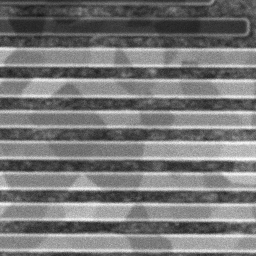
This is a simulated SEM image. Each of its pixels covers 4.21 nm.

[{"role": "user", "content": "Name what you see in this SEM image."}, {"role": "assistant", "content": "parallel lines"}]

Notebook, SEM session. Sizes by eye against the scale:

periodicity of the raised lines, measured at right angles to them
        130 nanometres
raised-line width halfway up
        68.9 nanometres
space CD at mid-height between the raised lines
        0.061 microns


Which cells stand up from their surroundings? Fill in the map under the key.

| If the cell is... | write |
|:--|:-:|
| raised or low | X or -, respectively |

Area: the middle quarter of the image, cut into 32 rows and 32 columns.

--------------------------------
--------------------------------
--------------------------------
--------------------------------
XXXXXXXXXXXXXXXXXXXXXXXXXXXXXXXX
XXXXXXXXXXXXXXXXXXXXXXXXXXXXXXXX
XXXXXXXXXXXXXXXXXXXXXXXXXXXXXXXX
XXXXXXXXXXXXXXXXXXXXXXXXXXXXXXXX
--------------------------------
--------------------------------
--------------------------------
--------------------------------
XXXXXXXXXXXXXXXXXXXXXXXXXXXXXXXX
XXXXXXXXXXXXXXXXXXXXXXXXXXXXXXXX
XXXXXXXXXXXXXXXXXXXXXXXXXXXXXXXX
XXXXXXXXXXXXXXXXXXXXXXXXXXXXXXXX
--------------------------------
--------------------------------
--------------------------------
--------X-----X-----------------
XXXXXXXXXXXXXXXXXXXXXXXXXXXXXXXX
XXXXXXXXXXXXXXXXXXXXXXXXXXXXXXXX
XXXXXXXXXXXXXXXXXXXXXXXXXXXXXXXX
XXXXXXXXXXXXXXXXXXXXXXXXXXXXXXXX
--------------------------------
--------------------------------
--------------------------------
XXXXXXXXXXXXXXXXXXXXXXXXXXX-----
XXXXXXXXXXXXXXXXXXXXXXXXXXXXXXXX
XXXXXXXXXXXXXXXXXXXXXXXXXXXXXXXX
XXXXXXXXXXXXXXXXXXXXXXXXXXXXXXXX
--------------------------------